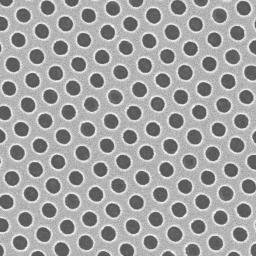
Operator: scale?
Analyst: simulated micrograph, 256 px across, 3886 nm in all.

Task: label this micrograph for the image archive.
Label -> a regular array of holes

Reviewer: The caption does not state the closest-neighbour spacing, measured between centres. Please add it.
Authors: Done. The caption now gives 363 nm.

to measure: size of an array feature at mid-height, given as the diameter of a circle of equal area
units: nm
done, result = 228